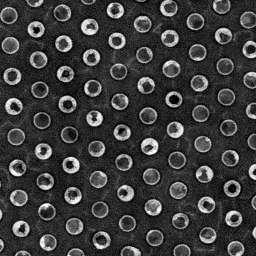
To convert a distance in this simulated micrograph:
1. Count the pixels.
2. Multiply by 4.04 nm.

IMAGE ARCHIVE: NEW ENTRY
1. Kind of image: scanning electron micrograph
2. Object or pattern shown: a regular array of raised bodies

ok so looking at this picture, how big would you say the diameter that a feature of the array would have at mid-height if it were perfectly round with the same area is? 65.1 nm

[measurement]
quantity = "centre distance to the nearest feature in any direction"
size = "122 nanometres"